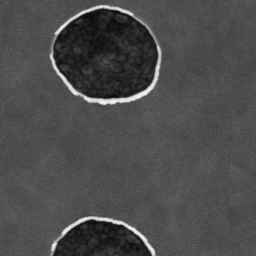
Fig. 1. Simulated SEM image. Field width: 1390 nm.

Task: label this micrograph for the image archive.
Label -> holes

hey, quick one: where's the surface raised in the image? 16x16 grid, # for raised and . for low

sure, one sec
################
####.....#######
###.......######
###.......######
####......######
#####....#######
################
################
################
################
################
################
################
################
####....########
###......#######